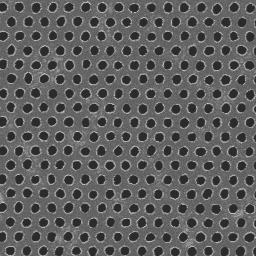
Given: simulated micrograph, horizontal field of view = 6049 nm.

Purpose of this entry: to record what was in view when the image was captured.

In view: a regular array of holes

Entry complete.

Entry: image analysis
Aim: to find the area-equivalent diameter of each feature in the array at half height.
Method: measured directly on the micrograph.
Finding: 212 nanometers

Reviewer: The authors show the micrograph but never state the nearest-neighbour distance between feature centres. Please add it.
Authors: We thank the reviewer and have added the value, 0.373 um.